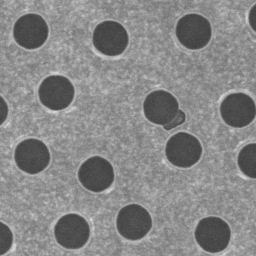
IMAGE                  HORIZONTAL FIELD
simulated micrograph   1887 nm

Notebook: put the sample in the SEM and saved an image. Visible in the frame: a regular array of holes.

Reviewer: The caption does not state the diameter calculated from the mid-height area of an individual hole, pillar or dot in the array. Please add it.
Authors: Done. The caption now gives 270 nanometres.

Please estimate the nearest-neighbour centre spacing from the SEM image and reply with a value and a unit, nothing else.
490 nm